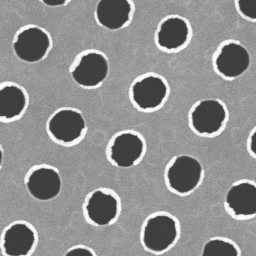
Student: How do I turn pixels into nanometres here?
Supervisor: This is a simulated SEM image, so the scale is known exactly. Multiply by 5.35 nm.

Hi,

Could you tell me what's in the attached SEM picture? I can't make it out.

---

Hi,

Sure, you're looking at a regular array of holes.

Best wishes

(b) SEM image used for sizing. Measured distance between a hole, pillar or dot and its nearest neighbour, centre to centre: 331 nanometers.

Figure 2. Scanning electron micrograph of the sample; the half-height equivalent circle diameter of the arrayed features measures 174 nanometres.